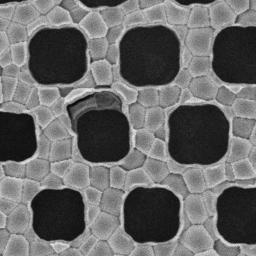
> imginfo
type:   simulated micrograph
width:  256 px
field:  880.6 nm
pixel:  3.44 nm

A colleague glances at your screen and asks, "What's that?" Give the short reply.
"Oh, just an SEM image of holes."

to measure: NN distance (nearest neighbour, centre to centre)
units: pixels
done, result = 89.8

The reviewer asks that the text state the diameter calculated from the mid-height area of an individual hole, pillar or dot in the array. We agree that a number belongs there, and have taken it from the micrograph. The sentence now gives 62.6 pixels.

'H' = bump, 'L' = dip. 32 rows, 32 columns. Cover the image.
HHHHHHHHHHLLLLLHHHHHHHLLLLHHHHHH
HHHHHHHHHHHHHHHHHHHHHHHHHHHHHHHH
HHHHHHHHHHHHHHHHHHHHHHHHHHHHHHHH
HHHHHHHHLHHHHHHHHLLLLHHHHHHHLLLL
HHHHLLLLLLLHHHHLLLLLLLHHHHHLLLLL
HHHHLLLLLLLHHHHLLLLLLLHHHHHLLLLL
HHHHLLLLLLLHHHHLLLLLLLHHHHHLLLLL
HHHHLLLLLLLHHHHLLLLLLLHHHHHLLLLL
HHHHLLLLLLLHHHHLLLLLLLHHHHHLLLLL
HHHHLLLLLLHHHHHLLLLLLLHHHHHLLLLL
HHHHHLLHHHHHHHHHLLLLLHHHHHHHHLHL
HHHHHHHHHHHHLLHHHHHHHHHHHHHHHHHH
HHHHHHHHHHHHLLLHHHHHHHHHHHHHHHHH
HHHHHHHHHHHLLLLHHHHHHHLLLLLHHHHH
LLLLHHHHHHLLLLLLHHHHHLLLLLLLHHHH
LLLLHHHHHLLLLLLLHHHHHLLLLLLLLHHH
LLLLHHHHHLLLLLLLHHHHHLLLLLLLLHHH
LLLLLHHHHHLLLLLLHHHHHLLLLLLLLHHH
LLLLLHHHHHLLLLLLHHHHHLLLLLLLHHHH
LLLLHHHHHHLLLLLLHHHHHLLLLLLLHHHH
HHHHHHHHHHHHHHHHHHHHHHHLHLLHHHHH
HHHHHHHHHHHHHHHHHHHHHHHHHHHHHHHH
HHHHHHHHHHHHHHHHHHHHHHHHHHHHHHHH
HHHHHHHHHHHHHHHHHLHLHHHHHHHHHLHH
HHHHLLLLLLHHHHHHLLLLLLHHHHHLLLLL
HHHHLLLLLLLHHHHHLLLLLLLHHHHLLLLL
HHHHLLLLLLLHHHHLLLLLLLLHHHHLLLLL
HHHHLLLLLLLHHHHLLLLLLLHHHHHLLLLL
HHHHLLLLLLLHHHHHLLLLLLHHHHHLLLLL
HHHHHLLLLLHHHHHHLLLLLLHHHHHHLLLL
HHHHHHHHHHHHHHHHHHHHHHHHHHHHHHHL
HHHHHHHHHHHHHHHHHHHHHHHHHHHHHHHH